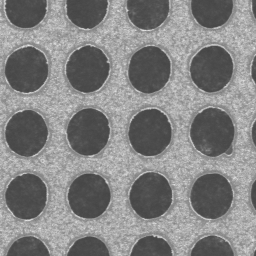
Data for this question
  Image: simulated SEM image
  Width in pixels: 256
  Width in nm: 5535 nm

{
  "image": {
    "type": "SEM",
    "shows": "a regular array of holes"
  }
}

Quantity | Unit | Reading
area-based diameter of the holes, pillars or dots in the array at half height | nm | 974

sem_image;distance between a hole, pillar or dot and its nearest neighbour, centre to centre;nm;1340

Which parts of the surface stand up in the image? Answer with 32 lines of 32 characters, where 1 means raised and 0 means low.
10000011000000110000011100000110
10000011000001110000011100000111
10000111100001110000011100001111
11111111110011111001111111011111
11111111111111111111111111111111
11111111111111111111111111111111
11000111100001111000111110001111
10000011100001110000011100000111
10000011000000110000011100000110
10000011000000110000011100000110
10000111100001110000011100001111
11101111110011111100111111011111
11111111111111111111111111111111
11111111111111111111111111011111
11000111100001111000011100000111
10000011100000110000011100000111
10000011000000110000001100000110
10000011000000110000011100000111
10000111100001111000011110000111
11101111111111111101111111011111
11111111111111111111111111111111
11111111111111111111111111111111
11000111100001111000011110001111
10000011100000110000011100000110
10000011100000110000001100000110
10000011100000110000011100000111
10000111100001111000011100001111
11111111111111111111111111111111
11111111111111111111111111111111
11111111111111111101111111011111
11000111100001111000011100000111
10000011100000110000011100000111